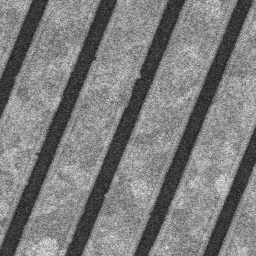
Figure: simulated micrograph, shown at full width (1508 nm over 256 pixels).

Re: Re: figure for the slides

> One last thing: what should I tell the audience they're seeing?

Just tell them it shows one or a few lines or trenches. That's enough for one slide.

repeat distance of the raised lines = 372 nm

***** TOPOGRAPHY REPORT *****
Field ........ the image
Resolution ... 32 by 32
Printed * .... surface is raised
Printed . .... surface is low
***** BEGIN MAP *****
***...******...******..******...
***...******..******...******..*
***..******...******..******...*
**...******...*****...******..**
**...******..******...******..**
*...******...******..******...**
*...******..******...******..***
*..******...******..******...***
...******...*****...******..****
..******...******...*****...****
..******...*****...******...****
..******..******...******..*****
.******...******..******...*****
.******...*****...******..******
******...******...*****...******
******...*****...******...******
******..******...******..******.
*****...******..******...******.
*****...*****...******..******..
****...******...*****...******..
****...*****...******...******..
****..******...******..******...
***...******..******...******..*
***..******...******..******...*
**...******..******...******...*
**...*****...******...******..**
**..******...******..******...**
*...******..******...******..***
*..******...******..******...***
...******..******...******...***
...*****...******..*******..****
..******...******..******...****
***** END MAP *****